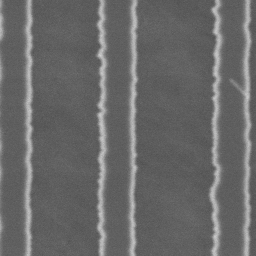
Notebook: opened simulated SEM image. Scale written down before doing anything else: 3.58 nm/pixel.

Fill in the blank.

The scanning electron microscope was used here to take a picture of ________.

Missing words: lines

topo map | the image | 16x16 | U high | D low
UUDDDDUUDDDDDUUU
UUDDDDUUDDDDDUUU
UUDDDDUUDDDDDDUU
UUDDDDUUDDDDDUUU
UUDDDDUUDDDDDUUU
UUDDDDUUDDDDDUUU
UUDDDDUUDDDDDUUU
UUDDDDUUDDDDDUUU
UUDDDDUUDDDDDUUU
UUDDDDUUDDDDDUUU
UUDDDDUUDDDDDUUU
UUDDDDUUDDDDDUUU
UUDDDDUUDDDDDUUU
UUDDDDUUDDDDDUUU
UUDDDDUUDDDDDUUU
UUDDDDUUDDDDDUUU